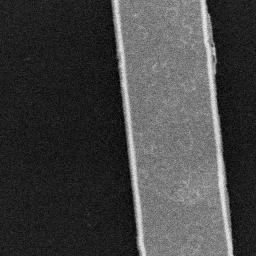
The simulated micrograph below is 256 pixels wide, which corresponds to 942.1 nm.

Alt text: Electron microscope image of one or a few lines or trenches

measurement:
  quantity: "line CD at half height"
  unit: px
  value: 86.6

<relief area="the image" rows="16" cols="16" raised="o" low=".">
.......oooooo...
.......oooooo...
........ooooo...
........ooooo...
........ooooo...
........ooooo...
........ooooo...
........oooooo..
........oooooo..
........oooooo..
........oooooo..
........oooooo..
.........ooooo..
.........ooooo..
.........ooooo..
.........ooooo..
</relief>